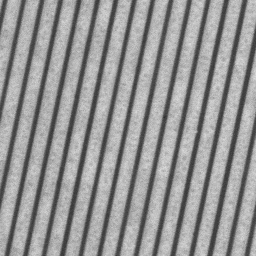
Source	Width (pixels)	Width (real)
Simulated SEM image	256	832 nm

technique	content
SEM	parallel lines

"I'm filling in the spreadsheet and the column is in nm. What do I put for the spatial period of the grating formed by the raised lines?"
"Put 58.7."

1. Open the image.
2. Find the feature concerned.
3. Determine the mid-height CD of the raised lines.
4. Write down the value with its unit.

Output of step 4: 39.4 nm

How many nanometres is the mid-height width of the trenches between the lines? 19.4